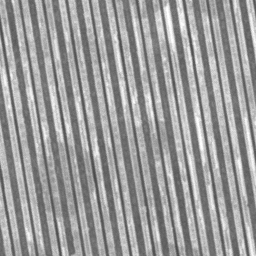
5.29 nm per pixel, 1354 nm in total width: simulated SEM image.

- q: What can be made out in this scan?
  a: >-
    parallel lines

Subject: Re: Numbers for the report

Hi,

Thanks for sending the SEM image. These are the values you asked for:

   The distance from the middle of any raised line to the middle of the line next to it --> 61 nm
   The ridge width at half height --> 31.4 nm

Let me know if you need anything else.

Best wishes